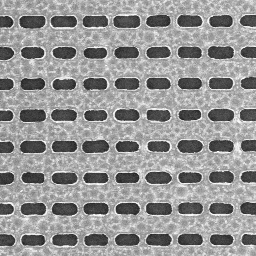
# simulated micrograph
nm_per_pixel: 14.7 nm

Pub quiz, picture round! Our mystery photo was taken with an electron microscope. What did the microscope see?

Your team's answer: a regular array of holes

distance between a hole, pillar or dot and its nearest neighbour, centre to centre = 0.454 µm